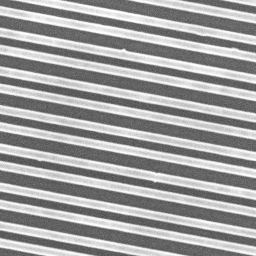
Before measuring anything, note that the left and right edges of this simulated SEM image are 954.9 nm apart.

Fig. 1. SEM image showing parallel lines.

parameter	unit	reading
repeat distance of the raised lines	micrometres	0.0711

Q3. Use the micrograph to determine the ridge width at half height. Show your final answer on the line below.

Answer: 27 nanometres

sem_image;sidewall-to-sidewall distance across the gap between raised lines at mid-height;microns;0.0372